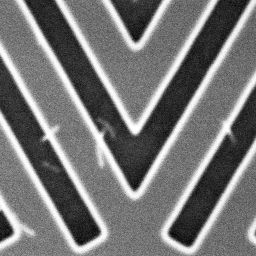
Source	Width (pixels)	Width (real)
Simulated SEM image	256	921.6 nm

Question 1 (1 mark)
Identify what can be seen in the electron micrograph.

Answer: groups of lines, slits or small figures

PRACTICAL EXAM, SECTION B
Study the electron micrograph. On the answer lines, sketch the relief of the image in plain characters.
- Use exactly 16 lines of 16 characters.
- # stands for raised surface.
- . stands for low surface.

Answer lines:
##..###...###...
##..####..###..#
###..###.###..##
###...#####...##
.###..#####..###
.###...###...###
..###..###..###.
..####..#..###..
#..###.....###..
#...###...###...
##..###...###..#
##...###.###..##
###..######...##
.###..#####..###
.###..####...###
################